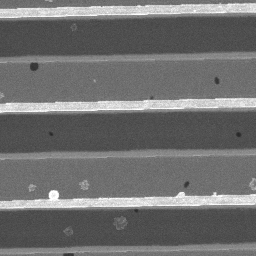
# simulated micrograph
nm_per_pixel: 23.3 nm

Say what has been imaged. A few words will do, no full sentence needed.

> lines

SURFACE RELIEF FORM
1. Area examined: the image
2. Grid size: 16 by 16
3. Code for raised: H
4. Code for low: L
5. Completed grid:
HHHHHHHHHHHHHHHH
LLLLLLLLLLLLLLLL
LLLLLLLLLLLLLLLL
LLLLLLLLLLLLLLLL
HHHHHHHHHHHHHHHH
HHHHHHHHHHHHHHHH
HHHHHHHHHHHHHHHH
LLLLLLLLLLLLLLLL
LLLLLLLLLLLLLLLL
LLLLLLLLLLLLLLLL
HHHHHHHHHHHHHHHH
HHHHHHHHHHHHHHHH
HHHHHHHHHHHHHHHH
LLLLLLLLLLLLLLLL
LLLLLLLLLLLLLLLL
LLLLLLLLLLLLLLLL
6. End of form